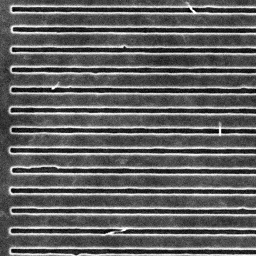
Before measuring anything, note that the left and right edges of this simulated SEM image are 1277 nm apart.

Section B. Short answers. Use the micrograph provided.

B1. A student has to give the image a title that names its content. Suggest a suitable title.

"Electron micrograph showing parallel lines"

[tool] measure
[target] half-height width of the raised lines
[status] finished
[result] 15.3 pixels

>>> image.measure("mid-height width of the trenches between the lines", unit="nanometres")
24.3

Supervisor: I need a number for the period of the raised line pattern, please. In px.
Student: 20.1